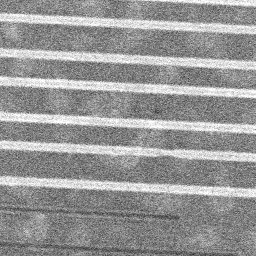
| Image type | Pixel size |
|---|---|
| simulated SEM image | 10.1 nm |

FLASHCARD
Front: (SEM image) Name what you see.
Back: parallel lines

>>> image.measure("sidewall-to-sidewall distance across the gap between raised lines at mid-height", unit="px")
28.6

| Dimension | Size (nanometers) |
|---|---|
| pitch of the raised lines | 328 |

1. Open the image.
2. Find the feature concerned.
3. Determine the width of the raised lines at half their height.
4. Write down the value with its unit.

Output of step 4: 67 nanometers